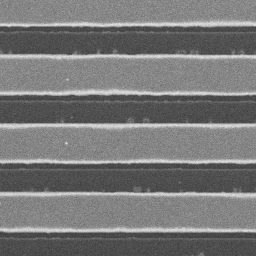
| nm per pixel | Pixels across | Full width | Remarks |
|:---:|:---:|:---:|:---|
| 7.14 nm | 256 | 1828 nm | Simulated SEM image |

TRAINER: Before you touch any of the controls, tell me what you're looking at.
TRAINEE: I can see lines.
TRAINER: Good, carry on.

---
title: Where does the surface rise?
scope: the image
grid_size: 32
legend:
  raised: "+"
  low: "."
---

++++++++++++++++++++++++++++++++
++++++++++++++++++++++++++++++++
++++++++++++++++++++++++++++++++
................................
................................
................................
................................
++++++++++++++++++++++++++++++++
++++++++++++++++++++++++++++++++
++++++++++++++++++++++++++++++++
++++++++++++++++++++++++++++++++
++++++++++++++++++++++++++++++++
................................
................................
................................
++++++++++++++++++++++++++++++++
++++++++++++++++++++++++++++++++
++++++++++++++++++++++++++++++++
++++++++++++++++++++++++++++++++
++++++++++++++++++++++++++++++++
................................
................................
................................
................................
++++++++++++++++++++++++++++++++
++++++++++++++++++++++++++++++++
++++++++++++++++++++++++++++++++
++++++++++++++++++++++++++++++++
++++++++++++++++++++++++++++++++
................................
................................
................................